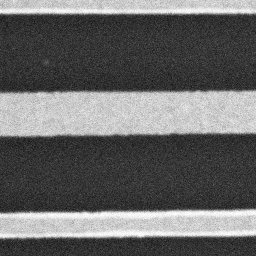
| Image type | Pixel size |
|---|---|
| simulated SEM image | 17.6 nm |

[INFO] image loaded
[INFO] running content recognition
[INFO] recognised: lines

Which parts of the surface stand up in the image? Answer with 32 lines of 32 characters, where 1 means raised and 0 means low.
11111111111111111111111111111111
00000000000000110000000000000000
00000000000000000000000000000000
00000000000000000000000000000000
00000000000000000000000000000000
00000000000000000000000000000000
00000000000000000000000000000000
00000000000000000000000000000000
00000000000000000000000000000000
00000000000000000000000000000000
00000000000000000000000000000000
00000000000000000000000110111111
11111111111111111111111111111111
11111111111111111111111111111111
11111111111111111111111111111111
11111111111111111111111111111111
11111111111111111111111111111111
00000000000000000000000000000000
00000000000000000000000000000000
00000000000000000000000000000000
00000000000000000000000000000000
00000000000000000000000000000000
00000000000000000000000000000000
00000000000000000000000000000000
00000000000000000000000000000000
00000000000000000000000000000000
00000000000000000000000000000111
11111111111111111111111111111111
11111111111111111111111111111111
11111111111000000000000000000000
00000000000000000000000000000000
00000000000000000000000000000000